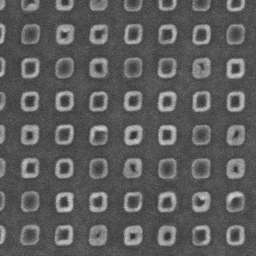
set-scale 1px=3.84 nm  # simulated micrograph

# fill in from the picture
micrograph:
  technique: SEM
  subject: a regular array of raised bodies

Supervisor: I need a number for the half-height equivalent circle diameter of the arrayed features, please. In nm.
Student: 75.8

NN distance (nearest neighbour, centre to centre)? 0.129 micrometres